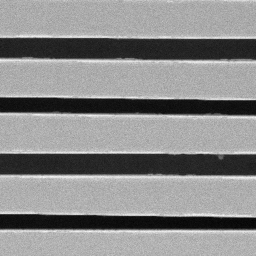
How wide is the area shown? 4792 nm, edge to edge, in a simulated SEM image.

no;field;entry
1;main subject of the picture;lines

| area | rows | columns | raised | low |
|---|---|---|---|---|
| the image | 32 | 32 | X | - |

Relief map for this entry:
XXXXXXXXXXXXXXXXXXXXXXXXXXXXXXXX
XXXXXXXXXXXXXXXXXXXXXXXXXXXXXXXX
XXXXXXXXXXXXXXXXXXXXXXXXXXXXXXXX
XXXXXXXXXXXXXXXXXXXXXXXXXXXXXXXX
XXXXXXXXXXXXXXXXXXXXXXXXXXXXXXXX
--------------------------------
--------------------------------
XXXXXX--------------------------
XXXXXXXXXXXXXXXXXXXXXXXXXXXXXXXX
XXXXXXXXXXXXXXXXXXXXXXXXXXXXXXXX
XXXXXXXXXXXXXXXXXXXXXXXXXXXXXXXX
XXXXXXXXXXXXXXXXXXXXXXXXXXXXXXXX
--------------------------------
--------------------------------
XXXXXXXXXXXXXXXXXXXXXXXXXXXXX---
XXXXXXXXXXXXXXXXXXXXXXXXXXXXXXXX
XXXXXXXXXXXXXXXXXXXXXXXXXXXXXXXX
XXXXXXXXXXXXXXXXXXXXXXXXXXXXXXXX
XXXXXXXXXXXXXXXXXXXXXXXXXXXXXXXX
--------------------------------
--------------------------------
--------------------------------
XXXXXXXXXXXXXXXXXXXXXXXXXXXXXXXX
XXXXXXXXXXXXXXXXXXXXXXXXXXXXXXXX
XXXXXXXXXXXXXXXXXXXXXXXXXXXXXXXX
XXXXXXXXXXXXXXXXXXXXXXXXXXXXXXXX
XXXXXXXXXXXXXXXXXXXXXXXXXXXXXXXX
--------------------------------
--------------------------------
XXXXXXXXXXXXXXXXXXXXXXXXXXXXXXXX
XXXXXXXXXXXXXXXXXXXXXXXXXXXXXXXX
XXXXXXXXXXXXXXXXXXXXXXXXXXXXXXXX